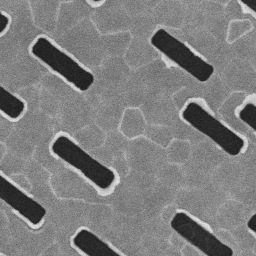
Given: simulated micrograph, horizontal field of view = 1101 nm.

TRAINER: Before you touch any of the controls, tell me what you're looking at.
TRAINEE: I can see holes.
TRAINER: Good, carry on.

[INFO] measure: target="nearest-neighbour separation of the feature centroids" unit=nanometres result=385